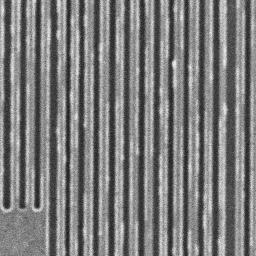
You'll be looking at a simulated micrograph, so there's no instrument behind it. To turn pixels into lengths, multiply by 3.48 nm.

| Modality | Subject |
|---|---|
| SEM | parallel lines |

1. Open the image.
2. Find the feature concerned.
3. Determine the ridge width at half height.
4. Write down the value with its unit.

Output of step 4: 0.027 µm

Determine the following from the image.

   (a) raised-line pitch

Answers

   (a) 52.2 nanometers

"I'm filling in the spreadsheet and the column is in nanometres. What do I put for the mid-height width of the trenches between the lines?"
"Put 23.5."